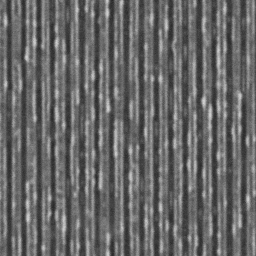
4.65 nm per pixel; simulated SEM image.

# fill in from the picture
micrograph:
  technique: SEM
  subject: parallel lines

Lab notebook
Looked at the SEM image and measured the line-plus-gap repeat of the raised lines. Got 0.0681 um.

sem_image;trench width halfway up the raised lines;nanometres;31.4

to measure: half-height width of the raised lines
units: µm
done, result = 0.036